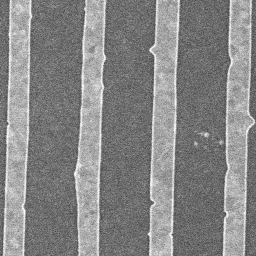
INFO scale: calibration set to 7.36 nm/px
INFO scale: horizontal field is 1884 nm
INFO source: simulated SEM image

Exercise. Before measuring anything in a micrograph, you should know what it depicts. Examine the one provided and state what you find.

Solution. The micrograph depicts one or a few lines or trenches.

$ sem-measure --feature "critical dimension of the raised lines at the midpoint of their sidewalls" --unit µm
0.153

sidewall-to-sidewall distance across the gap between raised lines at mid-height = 0.381 um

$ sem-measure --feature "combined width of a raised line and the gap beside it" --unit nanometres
540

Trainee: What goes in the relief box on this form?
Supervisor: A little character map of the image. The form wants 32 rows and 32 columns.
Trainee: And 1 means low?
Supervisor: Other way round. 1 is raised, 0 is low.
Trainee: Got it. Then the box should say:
01110000000110000000110000000110
01110000000110000000110000000110
01110000000110000000110000000110
01110000000110000001110000000110
01110000001110000001110000000110
01110000001110000001110000000110
01110000001110000001110000000110
01110000001110000001110000000110
01110000001110000001110000000110
01110000001110000001110000000110
01110000001110000001110000001110
01100000001110000001110000001110
01100000001110000001110000001110
01110000001110000001110000001110
01110000001110000001110000001110
01110000001110000001110000001111
01100000001110000001110000001110
01100000001110000001110000001110
01100000001100000001110000001110
01100000001100000001110000001110
01100000001100000001110000001110
01100000011100000001110000001110
01100000011100000001110000001110
01100000001100000001110000001110
01100000001100000001110000001110
01100000001100000001110000001110
01100000001100000001110000001110
01100000001100000001110000001110
01100000001100000001110000001110
01100000001100000001110000001110
01100000001100000001100000001110
11100000001100000001100000001110